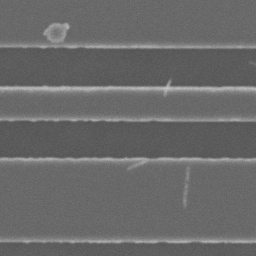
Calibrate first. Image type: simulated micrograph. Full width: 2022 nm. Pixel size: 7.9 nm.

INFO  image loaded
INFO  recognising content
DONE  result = lines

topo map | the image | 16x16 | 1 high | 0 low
1111111111111111
1111111111111111
1111111111111111
0000000000000000
0000000000000000
1111111111111111
1111111111111111
1011111111111111
0000000000000000
0000000000000000
1111111111111111
1111111111111111
1111111111111111
1111111111111111
1111111111111111
0000000000000000